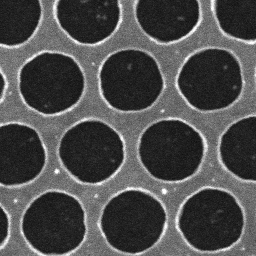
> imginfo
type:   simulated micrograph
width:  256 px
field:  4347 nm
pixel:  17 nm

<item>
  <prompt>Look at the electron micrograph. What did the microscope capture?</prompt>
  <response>a regular array of holes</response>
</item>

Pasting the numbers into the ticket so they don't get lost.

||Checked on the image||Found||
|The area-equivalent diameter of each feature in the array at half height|1.07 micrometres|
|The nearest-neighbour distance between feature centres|1350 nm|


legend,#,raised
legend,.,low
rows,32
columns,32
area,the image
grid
.....##........##........##.....
.....##........##........##.....
.....##........##........##.....
.....###.......###......####....
....#####.....#####....######...
...########.####################
###############...#######....###
####.....####......####.......##
###.......###.......###.......##
###.......##........##........##
.#.........##.......##........##
###.......###.......###.......##
###.......###.......###......###
####.....#####....######....####
################################
#.########...######....######...
.....###......####.......###....
.....###.......##........###....
.....##........##........###....
......#........###.......###....
......##.......###.......###....
.....####.....#####.....#####...
....######...#######...########.
################################
#####....######....#####.....###
####......###.......###.......##
.##.......###........##.......##
.##........##........#........##
.##........##.......##........##
.##........##.......###.......##
####......####.....#####.....###
#####....######...##############